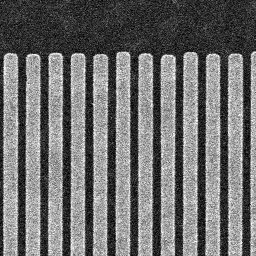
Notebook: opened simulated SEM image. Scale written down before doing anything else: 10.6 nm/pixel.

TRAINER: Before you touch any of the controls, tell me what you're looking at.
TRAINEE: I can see parallel lines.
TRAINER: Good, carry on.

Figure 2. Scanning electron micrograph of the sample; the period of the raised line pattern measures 237 nm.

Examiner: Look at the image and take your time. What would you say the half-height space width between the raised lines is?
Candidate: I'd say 96.3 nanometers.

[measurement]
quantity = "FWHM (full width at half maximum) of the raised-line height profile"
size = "140 nanometers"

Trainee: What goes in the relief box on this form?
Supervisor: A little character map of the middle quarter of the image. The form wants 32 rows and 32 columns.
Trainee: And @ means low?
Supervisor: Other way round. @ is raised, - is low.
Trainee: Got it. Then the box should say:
--@@@---@@@--@@@---@@@--@@@@--@@
--@@@---@@@--@@@---@@@--@@@@--@@
--@@@---@@@--@@@---@@@--@@@@--@@
--@@@---@@@--@@@---@@@--@@@@--@@
--@@@---@@@--@@@---@@@--@@@@--@@
--@@@---@@@--@@@---@@@--@@@@--@@
--@@@---@@@--@@@---@@@--@@@@--@@
--@@@---@@@--@@@---@@@--@@@@--@@
--@@@---@@@--@@@---@@@--@@@@--@@
--@@@--@@@@--@@@---@@@--@@@@--@@
--@@@--@@@@--@@@---@@@--@@@@--@@
--@@@---@@@--@@@---@@@--@@@@--@@
--@@@---@@@--@@@---@@@--@@@@--@@
--@@@---@@@--@@@---@@@--@@@@--@@
--@@@---@@@--@@@---@@@--@@@@--@@
--@@@---@@@--@@@---@@@--@@@---@@
--@@@---@@@--@@@---@@@--@@@---@@
--@@@---@@@--@@@---@@@--@@@---@@
--@@@---@@@--@@@---@@@--@@@---@@
--@@@---@@@--@@@---@@@--@@@---@@
--@@@---@@@--@@@---@@@--@@@---@@
--@@@---@@@--@@@---@@@---@@---@@
--@@@---@@@--@@@---@@@---@@---@@
--@@@---@@@--@@@---@@@---@@---@@
--@@@---@@@--@@@---@@@---@@---@@
--@@@---@@@--@@@---@@@---@@---@@
--@@@---@@@--@@@---@@@---@@---@@
--@@@---@@@--@@@---@@@---@@---@@
--@@@---@@@--@@@---@@@---@@---@@
--@@@---@@@--@@@---@@@---@@---@@
--@@@---@@@--@@@---@@@---@@---@@
--@@@---@@@--@@@---@@@---@@---@@